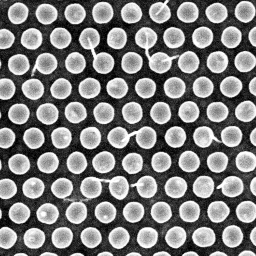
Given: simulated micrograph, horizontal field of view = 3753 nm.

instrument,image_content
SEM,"a regular array of raised bodies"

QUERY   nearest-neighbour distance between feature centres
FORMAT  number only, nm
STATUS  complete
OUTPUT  408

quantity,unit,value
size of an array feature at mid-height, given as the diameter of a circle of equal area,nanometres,299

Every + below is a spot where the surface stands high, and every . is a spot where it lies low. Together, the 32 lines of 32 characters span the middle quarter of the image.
+++++..+++++...++++...+++++..+++
.++++...++++...++++...++++....++
................................
................................
+...+++++..++++...++++...+++++..
++..+++++..+++++..+++++..+++++..
++..+++++..+++++..+++++..+++++..
+...+++++..++++...++++....++++..
......+.........................
...............................+
.++++...++++...++++...++++...+++
+++++...++++...++++...++++...+++
++++++..++++...++++...+++++..+++
.++++...++++...++++...++++...+++
..++.....++.....++.....+++....++
................................
+....+++....+++....+++....++++..
++..+++++..+++++.++++++...++++..
++..+++++..+++++..+++++..+++++..
++..+++++..+++++..+++++...++++..
+....+++.....++....+++.....++...
................................
..++.....+++....++.....+++....++
.++++...+++++..++++...+++++..+++
.++++..++++++..++++...+++++..+++
.+++++.+++++...++++...+++++..+++
..+++...++++...++++....+++....++
................................
......++....+++....+++.....++...
++...++++..+++++...++++...++++..
++..+++++..+++++..+++++..++++++.
++..+++++..+++++..+++++..++++++.